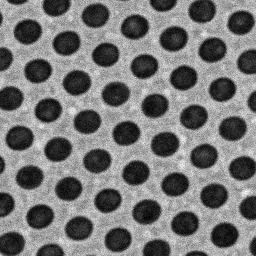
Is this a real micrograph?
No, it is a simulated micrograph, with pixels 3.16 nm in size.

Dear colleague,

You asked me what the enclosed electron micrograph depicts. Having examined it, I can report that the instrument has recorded a regular array of holes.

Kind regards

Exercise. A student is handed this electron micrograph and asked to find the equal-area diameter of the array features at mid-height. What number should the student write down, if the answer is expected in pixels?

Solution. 26.6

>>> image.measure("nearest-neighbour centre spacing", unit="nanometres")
126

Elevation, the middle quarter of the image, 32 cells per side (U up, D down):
UUUUUUUUUDDDUUUUUDDDDDDDUUUUUDDU
UUUUUUUUUUUUUUUUUDDDDDDUUUUDDDDD
UDDDDDUUUUUUUUUUUDDDDDDUUUUDDDDD
DDDDDDDUUUUUUUUUUUUDDUUUUUDDDDDD
DDDDDDDUUUUUDDUUUUUUUUUUUUUDDDDD
DDDDDDDUUUDDDDDDUUUUUUUUUUUDDDDD
DDDDDDUUUUDDDDDDUUUUUUUUUUUUDDDU
UDDDDUUUUDDDDDDDDUUUUUDDUUUUUUUU
UUUUUUUUUUDDDDDDUUUUDDDDDDUUUUUU
UUUUUUUUUUDDDDDUUUUUDDDDDDUUUUUU
UUUUUUUUUUUDDDUUUUUDDDDDDDUUUUUD
UUUUUDDUUUUUUUUUUUUDDDDDDDUUUUDD
UUUDDDDDDUUUUUUUUUUUDDDDDUUUUDDD
UUDDDDDDDUUUUUUUUUUUUUDUUUUUUDDD
UUDDDDDDDUUUUUDDDUUUUUUUUUUUUDDD
UUDDDDDDDUUUUDDDDDDUUUUUUUUUUUDD
UUUDDDDDUUUUDDDDDDDUUUUUUUUUUUUU
UUUUUDUUUUUUDDDDDDDUUUUDDDDDUUUU
UUUUUUUUUUUUDDDDDDDUUUDDDDDDUUUU
DUUUUUUUUUUUUDDDDDUUUUDDDDDDDUUU
DDUUUUUUUUUUUUDDUUUUUUDDDDDDDUUU
DDUUUUUDDDUUUUUUUUUUUUDDDDDDUUUU
DDUUUUDDDDDUUUUUUUUUUUUDDDDDUUUU
DUUUUDDDDDDDUUUUUUUUUUUUUUUUUUUU
UUUUUDDDDDDDUUUUUDDDUUUUUUUUUUUU
UUUUUDDDDDDDUUUDDDDDDUUUUUUUUUUU
UUUUUUDDDDDUUUUDDDDDDUUUUUUUUUUU
UUUUUUUUUUUUUUUDDDDDDUUUUUDDDDUU
DDDUUUUUUUUUUUUDDDDDDUUUUDDDDDDU
DDDDUUUUUUUUUUUUDDDDUUUUDDDDDDDU
DDDDDUUUUUUUUUUUUUUUUUUUDDDDDDDU
DDDDDUUUUDDDDUUUUUUUUUUUUDDDDDDU